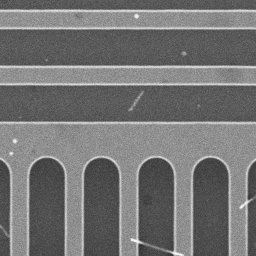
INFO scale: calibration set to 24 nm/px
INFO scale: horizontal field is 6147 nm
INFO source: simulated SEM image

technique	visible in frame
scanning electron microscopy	groups of lines, slits or small figures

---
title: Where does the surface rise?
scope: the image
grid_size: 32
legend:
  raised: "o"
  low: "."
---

................................
oooooooooooooooooooooooooooooooo
oooooooooooooooooooooooooooooooo
oooooooooooooooooooooooooooooooo
................................
................................
................................
................................
oooooooooooooooooooooooooooooooo
oooooooooooooooooooooooooooooooo
oooooooooooooooooooooooooooooooo
................................
................................
................................
................................
oooooooooooooooooooooooooooooooo
oooooooooooooooooooooooooooooooo
oooooooooooooooooooooooooooooooo
oooooooooooooooooooooooooooooooo
oooooooooooooooooooooooooooooooo
.ooo....ooo...oooo...oooo...ooo.
.ooo....oo.....oo.....oo.....oo.
.ooo....oo.....oo.....oo.....oo.
.oo.....oo.....oo.....oo.....oo.
.oo.....oo.....oo.....oo.....oo.
.oo.....oo.....oo.....oo.....oo.
.oo.....oo.....oo.....oo.....oo.
.oo.....oo.....oo.....oo.....oo.
.oo.....oo.....oo.....oo.....oo.
.oo.....oo.....oo.....oo.....oo.
.oo.....oo.....oo.....oo.....oo.
.oo.....oo.....oo.....oo.....oo.